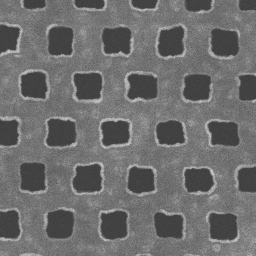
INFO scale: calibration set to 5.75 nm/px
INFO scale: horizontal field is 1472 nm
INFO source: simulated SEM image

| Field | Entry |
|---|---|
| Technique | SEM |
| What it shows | a regular array of holes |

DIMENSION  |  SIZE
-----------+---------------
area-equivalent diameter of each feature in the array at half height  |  162 nanometres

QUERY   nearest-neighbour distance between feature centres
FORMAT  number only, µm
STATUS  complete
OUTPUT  0.302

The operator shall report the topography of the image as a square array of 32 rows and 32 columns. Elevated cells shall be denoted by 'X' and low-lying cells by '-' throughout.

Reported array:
XXX---XXX----XXXX---XXX---XXXX--
XXXXXXXXXXXXXXXXXXXXXXXXXXXXXXXX
XXXXXXXXXXXXXXXXXXXXXXXXXXXXXXXX
--XXXXX--XXXXXXXXXXXXX-XXXXXXXXX
--XXXX---XXXX---XXXX---XXXX---XX
--XXXX---XXXX---XXXX---XXX----XX
XXXXXX---XXXX---XXXX---XXXX---XX
XXXXXXXXXXXXXXXXXXXXXXXXXXXXXXXX
XXXXXXXXXXXXXXXXXXXXXXXXXXXXXXXX
XXX---XXX----XXX--XXXXXX--XXXX--
XXX---XXX----XXX----XXX---XXXX--
XXX---XXXX---XXX----XXX---XXXX--
XXXXXXXXXXXXXXXXXXXXXXXX-XXXXX--
XXXXXXXXXXXXXXXXXXXXXXXXXXXXXXXX
XXXXXXXXXXXXXXXXXXXXXXXXXXXXXXXX
--XXXX---XXXX---XXXX---XXX---XXX
--XXXX---XXXX---XXXX---XXX----XX
--XXXX---XXXX---XXXX---XXX----XX
XXXXXXXXXXXXXXXXXXXXXXXXXXXXXXXX
XXXXXXXXXXXXXXXXXXXXXXXXXXXXXXXX
XXX--XXXXXXXXXXXXXXXXXXXXXXXXXXX
XXX---XXX----XXX---XXXX---XXXX--
XXX---XXX----XXX---XXXX----XXX--
XXX--XXXX----XXX---XXXX---XXXX--
XXXXXXXXXXXXXXXXXXXXXXXXXXXXXXXX
XXXXXXXXXXXXXXXXXXXXXXXXXXXXXXXX
--XXXX---XXXXX--XXXXXXXXXXXXXXXX
--XXXX---XXXX---XXX----XXX----XX
--XXXX---XXXX---XXX----XXX----XX
--XXXX---XXXX---XXXX---XXX----XX
XXXXXXXXXXXXXXXXXXXXXXXXXXXXXXXX
XXXXXXXXXXXXXXXXXXXXXXXXXXXXXXXX